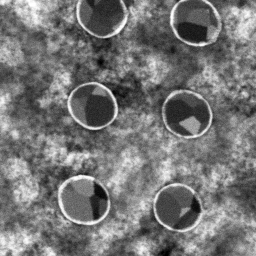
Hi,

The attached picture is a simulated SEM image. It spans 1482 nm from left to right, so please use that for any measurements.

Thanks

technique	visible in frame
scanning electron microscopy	raised bodies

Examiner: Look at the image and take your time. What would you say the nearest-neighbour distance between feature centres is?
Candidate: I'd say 545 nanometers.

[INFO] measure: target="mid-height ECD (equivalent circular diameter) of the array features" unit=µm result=0.277